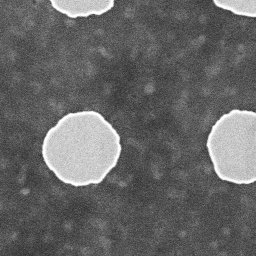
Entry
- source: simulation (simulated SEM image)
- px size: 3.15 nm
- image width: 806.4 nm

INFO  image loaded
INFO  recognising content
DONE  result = raised bodies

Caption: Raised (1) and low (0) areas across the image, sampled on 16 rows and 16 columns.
0000111000000011
0000000000000000
0000000000000000
0000000000000000
0000000000000000
0000000000000000
0000000000000000
0000111000000011
0001111000000111
0001111000000111
0001111000000111
0000000000000000
0000000000000000
0000000000000000
0000000000000000
0000000000000000